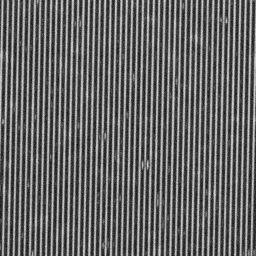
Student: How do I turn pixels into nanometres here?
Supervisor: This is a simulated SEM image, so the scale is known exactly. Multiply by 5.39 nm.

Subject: parallel lines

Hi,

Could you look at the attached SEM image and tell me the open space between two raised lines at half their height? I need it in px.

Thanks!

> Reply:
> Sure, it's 3.75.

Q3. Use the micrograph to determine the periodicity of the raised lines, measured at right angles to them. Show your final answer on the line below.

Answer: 29.1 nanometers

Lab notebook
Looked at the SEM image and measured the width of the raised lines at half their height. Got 0.0094 microns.